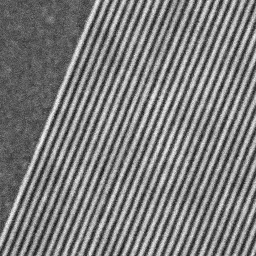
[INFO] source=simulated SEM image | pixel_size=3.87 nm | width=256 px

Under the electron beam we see parallel lines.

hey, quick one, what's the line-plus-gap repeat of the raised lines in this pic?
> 30.6 nm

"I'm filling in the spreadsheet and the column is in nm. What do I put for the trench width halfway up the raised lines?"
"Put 17.5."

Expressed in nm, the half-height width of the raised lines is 13.9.